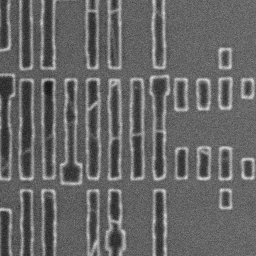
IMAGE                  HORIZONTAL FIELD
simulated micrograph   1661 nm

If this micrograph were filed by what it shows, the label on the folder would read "wiring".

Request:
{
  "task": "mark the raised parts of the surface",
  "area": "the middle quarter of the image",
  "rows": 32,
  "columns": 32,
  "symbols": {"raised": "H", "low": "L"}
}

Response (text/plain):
LLLLLLHHLLLHHHLLLLLLLLLHHLLLLLLL
LLLLLLLLLLLLLLLLLLLLLLLLLLLLLLLL
LLLLLLLLLLLLLLLLLLLLLLLLLLLLLLLL
LLLLLLLLLLLLLLLLLLLLLLHHHHLLLLLL
HHHLLLHHHLLHHHLLLHHHLLHHHHLLHHHL
HHHLLLHHHLLLHHLLLHHHLLHHHHLLHHHL
HHHLLLHHHLLHHHLLLHHHLLHHHHLLHHHL
HHHLLLHHHLLHHHLLLHHHLLHHHHLLHHHL
LHHLLLHHHLLHHHLLLHHHLLHHHLLLHHHL
LHHLLLHHHLLHHHLLLHHHLLHHHLLLHHHL
HHHLLLHHHLLHHHLLLHHHLLHHHLLLHHHL
HHHLLLHHHLLHHHLLLHHHLLLHHLLLHHLL
HHHLLLHHHLLHHHLLLHHHLLLHHLLLLLLL
HHHLLLHHHLLHHHLLLHHHLLLHHLLLLLLL
HHHLLLHHHLLHHHLLLHHHLLLHHLLLLLLL
HHHLLLHHHLLHHHLLLHHHLLLHHLLLLLLL
LHHLLLHHHLLHHHLLLHHHLLLHHLLLLLLL
LHHLLLHHHLLLHHLLLHHHLLLHHLLLLLLL
LHHLLLHHHLLLHHLLLHHHLLLHHLLLLLLL
LHHLLLHHHLLLHHLLLHHHLLLHHLLLLLLL
LHHLLLHHHLLHHHLLLHHHLLLHHLLLLLLL
LHHLLLHHHLLHHHLLLHHHLLLHHLLLHHHL
LHHLLLHHHLLHHHLLLHHHLLLHHLLLHHHL
LHHLLLHHHLLHHHLLLHHHLLLHHLLLHHHL
HHHLLLHHHLLHHHLLLHHHLLHHHLLLHHHL
HHHHLLHHHLLHHHLLLHHHLLHHHLLLHHHL
HHHHLLHHHLLHHHLLLHHHLLHHHLLLHHHL
HHHHLLHHHLLHHHLLLHHHLLLHHLLLHHHL
HHHHLLHHLLLHHHLLLHHHLLLHHLLLHHLL
HHHHLLLLLLLLLLLLLLLLLLLLLLLLLLLL
LLLLLLLLLLLLLLLLLLLLLLLLLLLLLLLL
LLLLLLLLLLLLLLLLLLLLLLLLLLLLLLLL